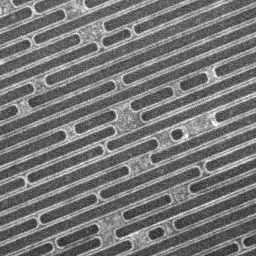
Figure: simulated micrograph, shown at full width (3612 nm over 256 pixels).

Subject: parallel lines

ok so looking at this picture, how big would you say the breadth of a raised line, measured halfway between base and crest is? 55.5 nm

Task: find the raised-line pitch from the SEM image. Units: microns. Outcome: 0.198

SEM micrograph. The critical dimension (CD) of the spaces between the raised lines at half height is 152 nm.